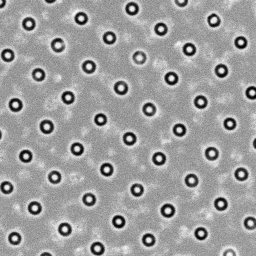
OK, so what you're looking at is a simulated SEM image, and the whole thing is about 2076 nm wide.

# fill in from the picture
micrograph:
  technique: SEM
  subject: a regular array of ring-shaped grooves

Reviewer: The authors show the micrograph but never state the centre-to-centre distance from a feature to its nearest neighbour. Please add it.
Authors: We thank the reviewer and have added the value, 286 nanometers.